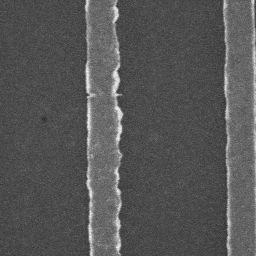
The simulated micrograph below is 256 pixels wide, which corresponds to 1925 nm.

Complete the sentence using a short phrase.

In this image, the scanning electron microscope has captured one or a few lines or trenches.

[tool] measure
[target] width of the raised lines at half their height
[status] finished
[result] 220 nm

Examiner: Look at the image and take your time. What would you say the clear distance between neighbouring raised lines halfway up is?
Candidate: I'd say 816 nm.